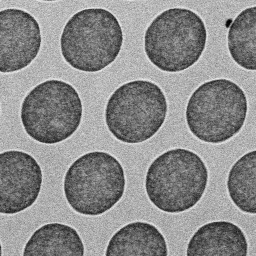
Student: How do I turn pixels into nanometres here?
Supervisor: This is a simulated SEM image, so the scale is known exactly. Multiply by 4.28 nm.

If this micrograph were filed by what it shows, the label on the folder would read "holes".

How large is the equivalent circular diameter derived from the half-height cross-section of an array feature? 0.267 um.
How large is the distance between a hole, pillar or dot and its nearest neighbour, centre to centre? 0.35 microns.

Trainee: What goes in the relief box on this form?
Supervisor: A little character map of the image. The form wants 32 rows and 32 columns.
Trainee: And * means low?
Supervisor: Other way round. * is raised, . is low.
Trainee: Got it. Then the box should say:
********************************
...*******....******....******..
....*****......****......****...
.....***.......***........***...
.....***.......***........**....
.....***.......***........**....
.....***.......***.......****...
....****......*****......****...
...******....*******...*******..
********************************
*****...********...******....***
****......****......****......**
***.......****.......***.......*
***.......***........**........*
***.......***........**........*
***.......***.......***.......**
***......*****......****......**
****....*******...*******...****
********************************
....******....******.....*****..
.....****......****......****...
.....***.......***........***...
.....***........**........**....
.....***........**........**....
.....***.......****......****...
....*****.....*****.....*****...
..********...********..********.
********************************
*****....******....******.....**
****......****......****.......*
***.......****.......**........*
***.......***........**........*